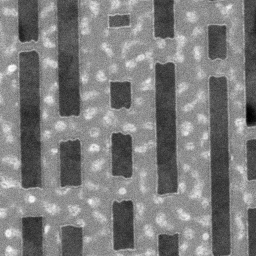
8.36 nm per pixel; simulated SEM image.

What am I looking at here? parallel lines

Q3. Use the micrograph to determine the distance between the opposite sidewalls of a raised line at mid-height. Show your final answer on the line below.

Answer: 179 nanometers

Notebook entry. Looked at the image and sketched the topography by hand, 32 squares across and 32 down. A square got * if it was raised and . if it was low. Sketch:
..***..***.........***........**
..***..***.........***........**
..***..***....**...***........**
..***..***.........***....**..**
..***..***.........***....**...*
.......***................**...*
...**..***................**...*
..***..***.....................*
.****..***.........***.........*
..***..***.........***.........*
..***..***....**...***....**...*
..***..***....**...***....***..*
..***..***....**...***....***..*
..***..***....**...***....***..*
..***...**.........***....***..*
..***..............***....***..*
..***..............***....***...
..***...**....***...**....***..*
...**..***....***...**....***..*
...**..***....***...**....***..*
...**..***....***...**....***..*
...**..***....***...**....***..*
...**...**..........**....***..*
...*................**....***...
..........................***...
..............***.........***...
..............***.........***..*
...**.........***.........***..*
...***..**....***.........***..*
...**...**....***...**....***..*
...**...**....***...**....***..*
...**...**..........**....***..*